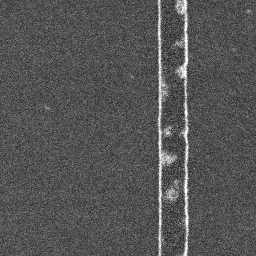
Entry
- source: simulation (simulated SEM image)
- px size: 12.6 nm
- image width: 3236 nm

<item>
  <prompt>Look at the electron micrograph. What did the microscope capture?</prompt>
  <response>one or a few lines or trenches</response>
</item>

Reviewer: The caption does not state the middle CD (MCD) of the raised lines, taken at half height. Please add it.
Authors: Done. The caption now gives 27.1 px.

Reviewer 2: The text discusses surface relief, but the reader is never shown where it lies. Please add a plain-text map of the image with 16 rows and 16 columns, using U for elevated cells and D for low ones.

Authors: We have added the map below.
DDDDDDDDDDUUDDDD
DDDDDDDDDDUUDDDD
DDDDDDDDDDUUDDDD
DDDDDDDDDDUUDDDD
DDDDDDDDDDUUDDDD
DDDDDDDDDDUUDDDD
DDDDDDDDDDUUDDDD
DDDDDDDDDDUUDDDD
DDDDDDDDDDUUDDDD
DDDDDDDDDDUUDDDD
DDDDDDDDDDUUDDDD
DDDDDDDDDDUUDDDD
DDDDDDDDDDUUDDDD
DDDDDDDDDDUUDDDD
DDDDDDDDDDUUDDDD
DDDDDDDDDDUUDDDD